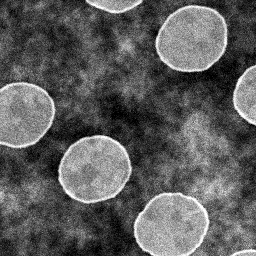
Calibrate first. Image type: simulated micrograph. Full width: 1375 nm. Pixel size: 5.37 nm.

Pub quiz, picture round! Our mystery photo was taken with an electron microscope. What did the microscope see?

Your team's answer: raised bodies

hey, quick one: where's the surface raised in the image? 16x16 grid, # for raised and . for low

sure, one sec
......##...##...
..........####..
..........####..
..........####..
...............#
##.............#
###............#
###............#
###.............
....####........
....####........
....####........
.....#....##....
.........####...
........#####...
.........###....